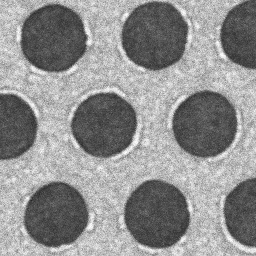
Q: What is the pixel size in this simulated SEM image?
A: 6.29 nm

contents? holes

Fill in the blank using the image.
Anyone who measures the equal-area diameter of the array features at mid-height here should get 422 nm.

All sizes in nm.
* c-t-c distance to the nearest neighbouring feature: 634